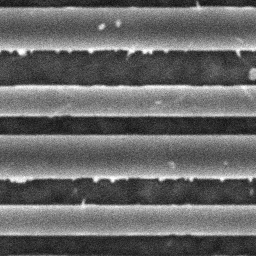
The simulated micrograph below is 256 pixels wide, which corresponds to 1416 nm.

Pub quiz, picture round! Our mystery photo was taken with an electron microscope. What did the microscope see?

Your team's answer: lines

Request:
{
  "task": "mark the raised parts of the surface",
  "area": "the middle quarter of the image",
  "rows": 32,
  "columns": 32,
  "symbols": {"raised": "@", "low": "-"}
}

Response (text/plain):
--------------------------------
--------------------------------
--------------------------------
--------------------------------
--------------------------------
--------------------------------
@@@@@@@@@@@@@@@@@@@@@@@@@@@@@@@@
@@@@@@@@@@@@@@@@@@@@@@@@@@@@@@@@
@@@@@@@@@@@@@@@@@@@@@@@@@@@@@@@@
@@@@@@@@@@@@@@@@@@@@@@@@@@@@@@@@
@@@@@@@@@@@@@@@@@@@@@@@@@@@@@@@@
@@@@@@@@@@@@@@@@@@@@@@@@@@@@@@@@
@@@@@@@@@@@@@@@@@@@@@@@@@@@@@@@@
--------------------------------
--------------------------------
--------------------------------
--------------------------------
--------------------------------
@@@@@@@@@@@@@@@@@@@@@@@@@@@@@@@@
@@@@@@@@@@@@@@@@@@@@@@@@@@@@@@@@
@@@@@@@@@@@@@@@@@@@@@@@@@@@@@@@@
@@@@@@@@@@@@@@@@@@@@@@@@@@@@@@@@
@@@@@@@@@@@@@@@@@@@@@@@@@@@@@@@@
@@@@@@@@@@@@@@@@@@@@@@@@@@@@@@@@
@@@@@@@@@@@@@@@@@@@@@@@@@@@@@@@@
@@@@@@@@@@@@@@@@@@@@@@@@@@@@@@@@
@@@@@@@@@@@@@@@@@@@@@@@@@@@@@@@@
@@@@@@@@@@@@@@@@@@@@@@@@@@@@@@@@
@@@@-----@@@@@@@---@@@@--@@@@---
--------------------------------
--------------------------------
--------------------------------